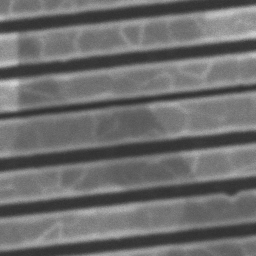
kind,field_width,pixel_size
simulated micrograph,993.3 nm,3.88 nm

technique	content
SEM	parallel lines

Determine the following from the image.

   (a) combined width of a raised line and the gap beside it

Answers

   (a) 0.177 microns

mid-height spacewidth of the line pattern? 64.6 nm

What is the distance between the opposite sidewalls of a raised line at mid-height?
29.2 pixels